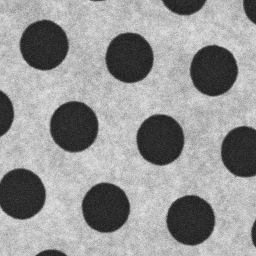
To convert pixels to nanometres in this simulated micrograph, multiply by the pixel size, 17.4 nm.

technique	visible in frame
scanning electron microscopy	holes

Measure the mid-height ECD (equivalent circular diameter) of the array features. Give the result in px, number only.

49.9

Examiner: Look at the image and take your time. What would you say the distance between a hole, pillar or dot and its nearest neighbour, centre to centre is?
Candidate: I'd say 1500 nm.